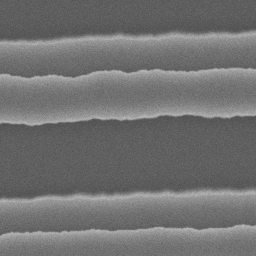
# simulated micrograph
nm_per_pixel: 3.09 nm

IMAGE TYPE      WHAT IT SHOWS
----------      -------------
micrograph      lines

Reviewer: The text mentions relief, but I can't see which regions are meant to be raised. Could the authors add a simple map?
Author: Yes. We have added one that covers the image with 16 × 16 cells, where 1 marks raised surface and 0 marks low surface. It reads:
0000000000000000
0000000000000000
0000011111111111
1111111111111111
1111111111111111
1111111111111111
1111111111111111
1111100000000000
0000000000000000
0000000000000000
0000000000000000
0000000000000000
0011111111111111
1111111111111111
1111111111111111
1111111111111111